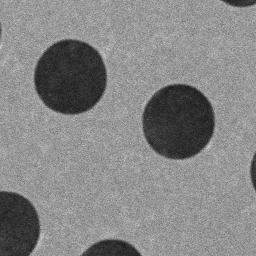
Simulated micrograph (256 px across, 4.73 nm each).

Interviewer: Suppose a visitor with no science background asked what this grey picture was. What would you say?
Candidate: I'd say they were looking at holes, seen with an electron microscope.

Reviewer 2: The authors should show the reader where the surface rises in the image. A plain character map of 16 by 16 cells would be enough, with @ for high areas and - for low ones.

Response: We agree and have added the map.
@@@@@@@@@@@@@@@@
@@@@@@@@@@@@@@@@
@@@@-@@@@@@@@@@@
@@@---@@@@@@@@@@
@@-----@@@@@@@@@
@@-----@@@--@@@@
@@@---@@@----@@@
@@@@@@@@@----@@@
@@@@@@@@@----@@@
@@@@@@@@@@--@@@@
@@@@@@@@@@@@@@@@
@@@@@@@@@@@@@@@@
--@@@@@@@@@@@@@@
--@@@@@@@@@@@@@@
--@@@@@@@@@@@@@@
--@@@@--@@@@@@@@